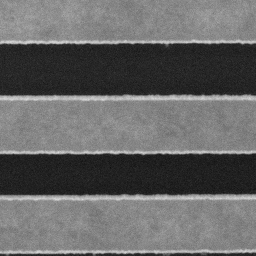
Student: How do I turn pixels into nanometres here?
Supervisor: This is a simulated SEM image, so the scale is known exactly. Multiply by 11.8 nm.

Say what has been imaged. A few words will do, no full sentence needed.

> lines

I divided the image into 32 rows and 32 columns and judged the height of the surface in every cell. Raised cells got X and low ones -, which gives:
XXXXXXXXXXXXXXXXXXXXXXXXXXXXXXXX
XXXXXXXXXXXXXXXXXXXXXXXXXXXXXXXX
XXXXXXXXXXXXXXXXXXXXXXXXXXXXXXXX
XXXXXXXXXXXXXXXXXXXXXXXXXXXXXXXX
XXXXXXXXXXXXXXXXXXXXXXXXXXXXXXXX
--------------------------------
--------------------------------
--------------------------------
--------------------------------
--------------------------------
--------------------------------
--------------------------------
XXXXXXXXXXXXXXXXXXXXXXXXXXXXXXXX
XXXXXXXXXXXXXXXXXXXXXXXXXXXXXXXX
XXXXXXXXXXXXXXXXXXXXXXXXXXXXXXXX
XXXXXXXXXXXXXXXXXXXXXXXXXXXXXXXX
XXXXXXXXXXXXXXXXXXXXXXXXXXXXXXXX
XXXXXXXXXXXXXXXXXXXXXXXXXXXXXXXX
XXXXXXXXXXXXXXXXXXXXXXXXXXXXXXXX
--------------------------------
--------------------------------
--------------------------------
--------------------------------
--------------------------------
--------------------X-----------
XXXXXXXXXXXXXXXXXXXXXXXXXXXXXXXX
XXXXXXXXXXXXXXXXXXXXXXXXXXXXXXXX
XXXXXXXXXXXXXXXXXXXXXXXXXXXXXXXX
XXXXXXXXXXXXXXXXXXXXXXXXXXXXXXXX
XXXXXXXXXXXXXXXXXXXXXXXXXXXXXXXX
XXXXXXXXXXXXXXXXXXXXXXXXXXXXXXXX
XXXXXXXXXXXXXXXXXXXXXXXXXXXXXXXX